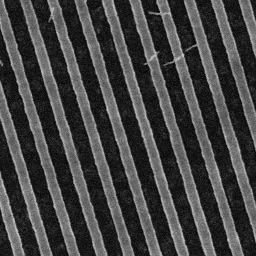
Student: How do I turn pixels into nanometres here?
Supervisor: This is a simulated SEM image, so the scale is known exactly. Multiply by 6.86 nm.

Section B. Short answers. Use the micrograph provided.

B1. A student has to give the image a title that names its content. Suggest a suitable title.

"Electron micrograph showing parallel lines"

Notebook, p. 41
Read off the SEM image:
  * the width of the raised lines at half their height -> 0.0707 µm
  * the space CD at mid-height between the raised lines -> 106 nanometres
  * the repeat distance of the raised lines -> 180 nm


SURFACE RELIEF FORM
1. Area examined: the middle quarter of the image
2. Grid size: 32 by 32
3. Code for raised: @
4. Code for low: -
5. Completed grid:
-@@----@@@----@@@----@@@----@@@-
-@@@----@@-----@@-----@@----@@@-
-@@@----@@@----@@@----@@@----@@-
--@@-----@@----@@@----@@@----@@@
--@@@----@@-----@@----@@@----@@@
--@@@----@@@----@@@----@@----@@@
--@@@----@@@----@@@----@@@----@@
---@@@----@@-----@@----@@@----@@
---@@@----@@@----@@-----@@----@@
---@@@----@@@----@@@----@@@----@
----@@----@@@----@@@----@@@----@
----@@@----@@-----@@-----@@----@
----@@@----@@@----@@-----@@@----
-----@@----@@@----@@@----@@@----
@----@@@----@@-----@@----@@@----
@----@@@----@@@----@@@----@@----
@@----@@----@@@----@@@----@@@---
@@----@@@----@@----@@@-----@@---
@@----@@@----@@@----@@-----@@---
@@-----@@----@@@----@@@----@@@--
@@@----@@-----@@----@@@----@@@--
@@@----@@@----@@@----@@----@@@--
@@@----@@@----@@@----@@@----@@--
-@@-----@@----@@@----@@@----@@@-
-@@@----@@@----@@@----@@----@@@-
-@@@----@@@----@@@----@@-----@@-
--@@-----@@----@@@----@@@----@@@
--@@@----@@@----@@----@@@----@@@
--@@@----@@@----@@@----@@-----@@
--@@@----@@@----@@@----@@@----@@
---@@@----@@----@@@----@@@----@@
---@@@----@@@----@@-----@@----@@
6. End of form